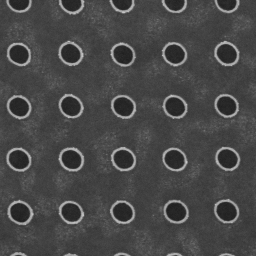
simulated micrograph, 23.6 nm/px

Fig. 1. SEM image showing a regular array of raised bodies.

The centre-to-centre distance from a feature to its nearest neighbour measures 1210 nm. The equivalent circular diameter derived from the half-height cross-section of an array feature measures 521 nm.